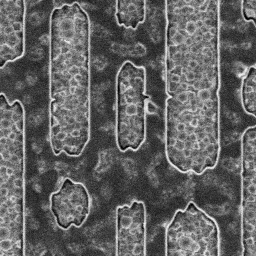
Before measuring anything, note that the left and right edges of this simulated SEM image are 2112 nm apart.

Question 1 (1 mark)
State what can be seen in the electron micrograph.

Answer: one or a few lines or trenches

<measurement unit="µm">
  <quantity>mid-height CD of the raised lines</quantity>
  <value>0.232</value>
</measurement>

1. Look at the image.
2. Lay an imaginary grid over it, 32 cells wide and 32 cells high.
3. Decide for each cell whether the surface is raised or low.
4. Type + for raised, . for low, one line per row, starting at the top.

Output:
...++++++++++++...+++......+++..
...++++...+++++...+++......++++.
...+++.....++++...+++......++++.
...+++..+..++++++++++......+++++
...+++.....++++++++++......+++++
...+++.....++++++++++......+++++
...+++.....++++++++++......+++++
.+++++.....++++++++++......+++++
++++++.....++++...+++......+++++
++++++.....++++...+++......++++.
++++++.....++++...+++......+++..
++++++.....++++...+++......+++..
.++++++....++++...+++......+++..
...+++.....++++...+++......++++.
...+++.....++++...+++......+++++
...+++.....++++...+++......+++++
...+++.....++++...+++......++++.
...+++.....++++...+++......+++..
...++++...+++++..++++......+++..
...++++++++++++++++++......+++..
...+++++++++++++++++++.....+++..
...+++++++++++++++++++++.+++++..
...+++++++++++++++++++++++++++..
...+++++...+++++++++++++++++++..
...++++....+++++++++++++++++++..
...+++.....++++++.++++++++++++..
...++++....++++...++++...+++++..
...++++....++++...++++.....+++..
...++++++++++++...+++......+++..
...++++++++++++...+++......+++..
+..++++++++++++...+++......+++..
...++++++++++++...+++......+++..